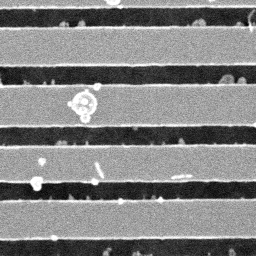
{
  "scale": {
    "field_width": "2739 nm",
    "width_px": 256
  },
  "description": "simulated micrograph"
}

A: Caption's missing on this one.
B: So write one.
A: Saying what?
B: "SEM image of lines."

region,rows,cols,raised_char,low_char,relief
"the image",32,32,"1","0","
11111111111111111111111111111111
00000000000000000000000000000000
00000000000000000000000000000000
00000000011111111111111111111111
11111111111111111111111111111111
11111111111111111111111111111111
11111111111111111111111111111111
11111111111111111111111111111111
00000000000000000000000000000000
00000000000000000000000000000000
00000000000010000000000000000000
11111111111111111111111111111111
11111111111111111111111111111111
11111111111111111111111111111111
11111111111111111111111111111111
11111111111111111111111111111111
00000000000000000000000000000000
00000000000000000000000000000000
11111111111111111111111111111111
11111111111111111111111111111111
11111111111111111111111111111111
11111111111111111111111111111111
11111111111111111111111111111111
00001000000000000000000000000000
00000000000000000000000000000000
11111111111111111111111111111111
11111111111111111111111111111111
11111111111111111111111111111111
11111111111111111111111111111111
11111111111111111111111111111111
00000000000000000000000000000000
00000000000000000000000000000000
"